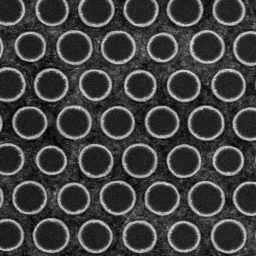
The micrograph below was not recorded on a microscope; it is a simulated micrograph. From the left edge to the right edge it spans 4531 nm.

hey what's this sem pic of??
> a regular array of raised bodies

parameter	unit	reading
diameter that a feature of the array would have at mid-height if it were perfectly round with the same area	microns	0.56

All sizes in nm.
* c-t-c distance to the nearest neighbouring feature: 765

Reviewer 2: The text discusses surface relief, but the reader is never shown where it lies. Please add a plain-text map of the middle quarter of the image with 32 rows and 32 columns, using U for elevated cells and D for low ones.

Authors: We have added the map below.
DDDDDDDDDDDDDDDDDDDDDDDDDDDDDDDD
DDDDDDDDDDDDDDDDDDDDDDDDDDDDDDDD
DDDDDUUUUUDDDDDDDUUUUDDDDDDDUUUU
DDDDUUUUUUUDDDDDUUUUUUDDDDDUUUUU
UDDDUUUUUUUDDDDUUUUUUUUDDDUUUUUU
UDDDUUUUUUUUDDDUUUUUUUUDDDUUUUUU
UDDDDUUUUUUDDDDUUUUUUUUDDDUUUUUU
DDDDDUUUUUUDDDDDUUUUUUDDDDDUUUUU
DDDDDDUUUDDDDDDDDUUUUDDDDDDDUUUU
DDDDDDDDDDDDDDDDDDDDDDDDDDDDDDDD
DDDDDDDDDDDDDDDDDDDDDDDDDDDDDDDD
UUUUUDDDDDDUUUUDDDDDDDUUUUUDDDDD
UUUUUUDDDDUUUUUUUDDDDUUUUUUUDDDD
UUUUUUDDDUUUUUUUUDDDDUUUUUUUDDDU
UUUUUUDDDUUUUUUUUDDDDUUUUUUUUDDU
UUUUUUDDDUUUUUUUUDDDDUUUUUUUDDDU
UUUUUUDDDDUUUUUUUDDDDUUUUUUUDDDD
UUUUUDDDDDDUUUUUDDDDDDUUUUUDDDDD
DDUUDDDDDDDDDDDDDDDDDDDDDDDDDDDD
DDDDDDDDDDDDDDDDDDDDDDDDDDDDDDDD
DDDDDDUUUDDDDDDDDUUUUDDDDDDDDUUD
DDDDDUUUUUUDDDDDUUUUUUDDDDDUUUUU
DDDDUUUUUUUUDDDUUUUUUUUDDDDUUUUU
DDDDUUUUUUUUDDDUUUUUUUUDDDUUUUUU
DDDDUUUUUUUUDDDUUUUUUUUDDDUUUUUU
DDDDUUUUUUUUDDDUUUUUUUUDDDUUUUUU
DDDDDUUUUUUDDDDDUUUUUUDDDDDUUUUU
DDDDDDUUUUDDDDDDDUUUUDDDDDDDUUUU
DDDDDDDDDDDDDDDDDDDDDDDDDDDDDDDD
DDDDDDDDDDDDDDDDDDDDDDDDDDDDDDDD
DUUUDDDDDDDUUUUUDDDDDDUUUUUDDDDD
UUUUUDDDDDUUUUUUUDDDDUUUUUUUDDDD